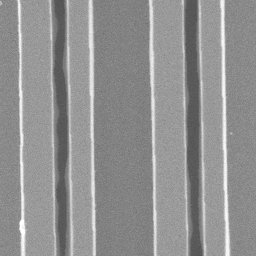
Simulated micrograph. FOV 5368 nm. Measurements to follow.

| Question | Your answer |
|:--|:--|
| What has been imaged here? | lines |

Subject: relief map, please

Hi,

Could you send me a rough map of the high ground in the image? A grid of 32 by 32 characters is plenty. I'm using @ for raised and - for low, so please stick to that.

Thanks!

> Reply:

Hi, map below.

--@@@@--@@@--------@@@@--@@@----
---@@@--@@@--------@@@@--@@@----
---@@@--@@@--------@@@@--@@@----
---@@@@-@@@--------@@@@--@@@----
---@@@--@@@--------@@@@--@@@----
---@@@--@@@--------@@@@--@@@----
---@@@@-@@@--------@@@@--@@@----
---@@@@-@@@--------@@@@--@@@----
---@@@@-@@@--------@@@@--@@@----
---@@@@-@@@--------@@@@--@@@----
---@@@@--@@--------@@@@--@@@----
---@@@@--@@--------@@@@--@@@----
---@@@@--@@--------@@@@--@@@----
---@@@@--@@--------@@@@--@@@----
---@@@@--@@--------@@@@--@@@----
---@@@@--@@--------@@@@--@@@----
---@@@@--@@--------@@@@--@@@----
---@@@@--@@--------@@@@--@@@----
---@@@@--@@--------@@@@--@@@----
---@@@@--@@--------@@@@--@@@----
---@@@@--@@--------@@@@--@@@----
---@@@@--@@--------@@@@--@@@----
---@@@@--@@--------@@@@--@@@----
---@@@@--@@@-------@@@@--@@@----
---@@@@--@@@-------@@@@--@@@----
---@@@@--@@@-------@@@@--@@@----
---@@@@--@@@-------@@@@--@@@----
---@@@@--@@@-------@@@@--@@@----
---@@@@--@@@-------@@@@@-@@@----
---@@@@--@@@-------@@@@@-@@@----
---@@@@--@@@-------@@@@@-@@@----
---@@@@--@@@-------@@@@@-@@@----